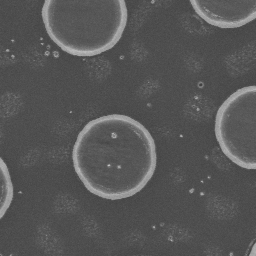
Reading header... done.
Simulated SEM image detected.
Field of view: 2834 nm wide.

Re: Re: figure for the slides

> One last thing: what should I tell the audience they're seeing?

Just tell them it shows raised bodies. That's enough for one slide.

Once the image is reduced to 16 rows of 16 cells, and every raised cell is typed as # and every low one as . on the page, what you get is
...#####....####
...#####......#.
...####.........
................
................
................
..............##
......##......##
.....####.....##
.....#####....##
.....#####......
#....####.......
#...............
................
................
................